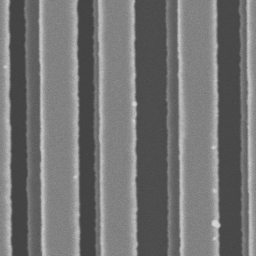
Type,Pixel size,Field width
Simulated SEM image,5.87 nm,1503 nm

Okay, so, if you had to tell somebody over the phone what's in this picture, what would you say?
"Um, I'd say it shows lines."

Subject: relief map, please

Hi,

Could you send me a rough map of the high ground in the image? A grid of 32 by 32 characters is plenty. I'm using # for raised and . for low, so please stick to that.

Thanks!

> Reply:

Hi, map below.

#..#######..#####....######...##
#..#######..#####....######...##
#..#######..#####....######...##
#..#######..#####....######...##
#..#######..#####....######...##
#..#######..#####....######...##
#..#######..#####....######...##
#..#######..#####....######...##
#..#######..#####....######...##
#..#######..#####....######...##
#..#######..#####....######...##
#..#######..#####....######...##
#..#######..#####....######...##
#..#######..#####....######...##
#..#######..#####....######...##
#..#######..#####....######...##
#..#######..#####....######...##
#..#######..#####....######...##
#..#######..#####....######...##
#..#######..#####....######...##
#..#######..#####....######...##
#...######..#####....######...##
#..#######..#####....######...##
#..#######..#####....######...##
#..#######..#####....######...##
#...######..#####....######...##
#...######..#####....######...##
#..#######..#####....######...##
#...######..#####....######...##
#...######..#####....######...##
#...######..#####....######...##
#...######..#####....######...##